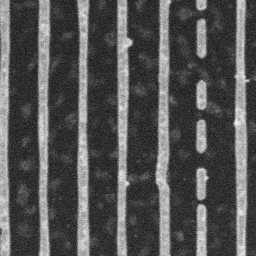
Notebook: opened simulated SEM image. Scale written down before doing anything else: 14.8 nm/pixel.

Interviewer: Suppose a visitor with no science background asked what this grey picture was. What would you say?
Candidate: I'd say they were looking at parallel lines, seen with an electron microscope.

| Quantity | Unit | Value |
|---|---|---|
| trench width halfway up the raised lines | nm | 463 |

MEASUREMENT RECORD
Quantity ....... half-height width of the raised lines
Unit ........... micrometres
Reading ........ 0.124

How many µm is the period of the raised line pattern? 0.585